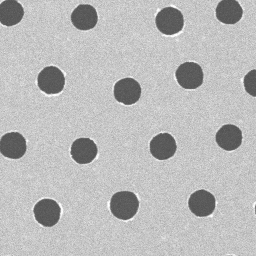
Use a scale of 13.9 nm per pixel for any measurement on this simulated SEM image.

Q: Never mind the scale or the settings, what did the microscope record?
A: a regular array of holes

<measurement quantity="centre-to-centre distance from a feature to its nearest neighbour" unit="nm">940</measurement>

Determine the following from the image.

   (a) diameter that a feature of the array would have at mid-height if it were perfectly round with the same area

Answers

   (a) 0.387 µm